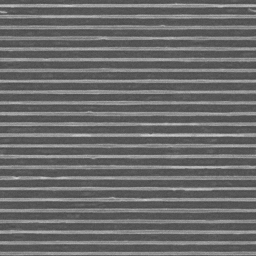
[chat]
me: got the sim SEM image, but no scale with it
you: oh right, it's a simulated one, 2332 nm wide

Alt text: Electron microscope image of parallel lines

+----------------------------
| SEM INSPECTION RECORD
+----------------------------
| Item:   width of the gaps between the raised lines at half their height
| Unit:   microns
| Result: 0.0729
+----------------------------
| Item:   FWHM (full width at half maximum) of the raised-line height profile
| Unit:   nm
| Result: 23.9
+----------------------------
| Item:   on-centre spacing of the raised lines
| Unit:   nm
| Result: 98.1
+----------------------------